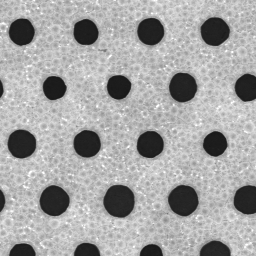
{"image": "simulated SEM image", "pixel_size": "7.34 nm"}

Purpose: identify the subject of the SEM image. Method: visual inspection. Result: a regular array of holes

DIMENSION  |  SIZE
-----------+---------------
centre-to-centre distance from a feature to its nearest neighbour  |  471 nm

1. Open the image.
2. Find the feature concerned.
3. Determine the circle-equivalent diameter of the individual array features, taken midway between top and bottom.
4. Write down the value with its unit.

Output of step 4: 201 nanometers